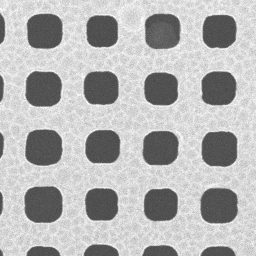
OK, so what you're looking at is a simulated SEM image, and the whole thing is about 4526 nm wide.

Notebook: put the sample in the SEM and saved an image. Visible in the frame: a regular array of holes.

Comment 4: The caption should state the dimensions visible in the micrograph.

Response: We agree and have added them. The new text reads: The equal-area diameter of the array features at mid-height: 654 nanometers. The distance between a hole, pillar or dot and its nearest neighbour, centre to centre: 1010 nanometers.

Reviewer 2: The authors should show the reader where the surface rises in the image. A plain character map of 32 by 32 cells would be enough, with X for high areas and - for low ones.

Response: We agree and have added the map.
XXXXXXXXXXXXXXXXXXXXXXXXXXXXXXXX
XXXXXXXXXXXXXXXXXXXXXXXXXXXXXXXX
-XXX----XXX---XXXX----XXXX---XXX
-XX-----XXX----XXX-----XX-----XX
-XX-----XXX----XXX-----XX-----XX
XXXX---XXXX---XXXX----XXXX---XXX
XXXXXXXXXXXXXXXXXXXXXXXXXXXXXXXX
XXXXXXXXXXXXXXXXXXXXXXXXXXXXXXXX
XXXXXXXXXXXXXXXXXXXXXXXXXXXXXXXX
XXXX---XXXX---XXXXX---XXXX---XXX
XXX-----XX-----XXX----XXX-----XX
XXX-----XX-----XXX----XXX-----XX
XXX-----XXX----XXX----XXX----XXX
XXXXXXXXXXXXXXXXXXXXXXXXXXXXXXXX
XXXXXXXXXXXXXXXXXXXXXXXXXXXXXXXX
XXXXXXXXXXXXXXXXXXXXXXXXXXXXXXXX
XXXX---XXXXX--XXXXX--XXXXX---XXX
XXX-----XXX----XXX----XXX-----XX
XXX-----XXX----XXX----XXX-----XX
XXX-----XXX----XXX----XXX-----XX
XXXX---XXXXXXXXXXXX--XXXXX---XXX
XXXXXXXXXXXXXXXXXXXXXXXXXXXXXXXX
XXXXXXXXXXXXXXXXXXXXXXXXXXXXXXXX
XXXX---XXXXXXXXXXXXXXXXXXXX-XXXX
XXX-----XXX----XXX----XXX-----XX
XXX-----XXX----XXX----XXX-----XX
XXX-----XXX----XXX----XXX-----XX
XXXX---XXXXX--XXXXX--XXXXX---XXX
XXXXXXXXXXXXXXXXXXXXXXXXXXXXXXXX
XXXXXXXXXXXXXXXXXXXXXXXXXXXXXXXX
XXXXXXXXXXXX-XXXXXXXXXXXXXXXXXXX
XXX----XXXX----XXX----XXX----XXX